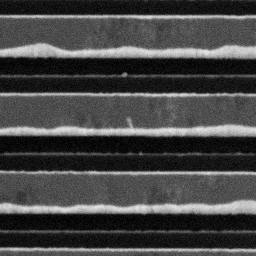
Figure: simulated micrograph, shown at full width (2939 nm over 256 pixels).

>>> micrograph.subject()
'lines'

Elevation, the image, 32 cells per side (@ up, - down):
--------------------------------
--------------------------------
@@@@@@@@@@@@@@@@@@@@@@@@@@@@@@@@
@@@@@@@@@@@@@@@@@@@@@@@@@@@@@@@@
@@@@@@@@@@@@@@@@@@@@@@@@@@@@@@@@
@@@@@@@@@@@@@@@@@@@@@@@@@@@@@@@@
@@@@@@@@@@@@@@@@@@@@@@@@@@@@@@@@
--------------------------------
--------------------------------
--------------------------------
--------------------------------
--------------------------------
@@@@@@@@@@@@@@@@@@@@@@@@@@@@@@@@
@@@@@@@@@@@@@@@@@@@@@@@@@@@@@@@@
@@@@@@@@@@@@@@@@@@@@@@@@@@@@@@@@
@@@@@@@@@@@@@@@@@@@@@@@@@@@@@@@@
@@@@@@@@@@@@@@@@@@@@@@@@@@@@@@@@
--------------------------------
--------------------------------
--------------------------------
--------------------------------
@@@-@@@-@@-@--------------------
@@@@@@@@@@@@@@@@@@@@@@@@@@@@@@@@
@@@@@@@@@@@@@@@@@@@@@@@@@@@@@@@@
@@@@@@@@@@@@@@@@@@@@@@@@@@@@@@@@
@@@@@@@@@@@@@@@@@@@@@@@@@@@@@@@@
--------@-----------------------
--------------------------------
--------------------------------
--------------------------------
--------------------------------
@@@@@@@@@@@@@@@@@@@@@@@@@@@@@@@@